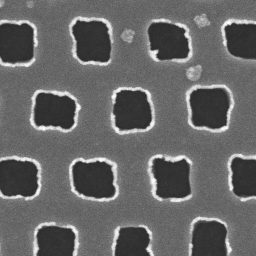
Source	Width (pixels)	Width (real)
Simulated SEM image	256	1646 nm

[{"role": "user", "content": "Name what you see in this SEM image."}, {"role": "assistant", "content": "holes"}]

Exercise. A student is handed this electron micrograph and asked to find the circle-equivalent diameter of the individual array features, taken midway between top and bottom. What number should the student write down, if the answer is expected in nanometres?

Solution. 262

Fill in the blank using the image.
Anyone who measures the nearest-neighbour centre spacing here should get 499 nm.